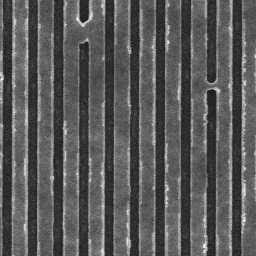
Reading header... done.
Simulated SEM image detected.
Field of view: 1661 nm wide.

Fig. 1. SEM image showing parallel lines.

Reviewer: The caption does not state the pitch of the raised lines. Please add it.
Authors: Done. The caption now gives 0.166 µm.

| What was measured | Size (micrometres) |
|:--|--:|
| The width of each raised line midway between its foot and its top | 0.103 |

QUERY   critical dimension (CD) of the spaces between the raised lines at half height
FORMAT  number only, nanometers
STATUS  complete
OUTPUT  64.9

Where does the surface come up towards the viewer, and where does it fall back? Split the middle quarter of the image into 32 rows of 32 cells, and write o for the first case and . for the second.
oooo..oooo...ooo...oooo..oooo...
oooo..oooo...ooo...oooo..oooo...
oooo..oooo...ooo...oooo..oooo...
oooo..oooo...ooo...oooo..oooo...
oooo..oooo...ooo...oooo..oooo...
oooo..oooo...ooo...oooo..oooo...
oooo..oooo...ooo...oooo..oooo...
oooo..oooo...ooo...oooo..oooo...
oooo..oooo...ooo...oooo..oooo...
oooo..oooo...ooo...oooo..oooo...
oooo..oooo...oooo..oooo..oooo...
oooo..oooo...oooo..oooo..oooo...
oooo..oooo...oooo..oooo..oooo...
oooo..oooo...ooo...oooo..oooo...
oooo..oooo...ooo...oooo..oooo...
oooo..oooo...ooo...oooo..oooo...
oooo..oooo...ooo...oooo..oooo...
oooo..oooo...ooo...oooo..oooo...
oooo..oooo...ooo...oooo..oooo...
oooo..oooo...ooo...oooo..oooo...
oooo..oooo...ooo...oooo..oooo...
oooo..oooo...ooo...oooo..oooo...
oooo..oooo...ooo...oooo..oooo...
oooo..oooo...ooo...oooo..oooo...
oooo..oooo...ooo...oooo..oooo...
oooo..oooo...ooo...oooo..oooo...
oooo..oooo...ooo...oooo...ooo...
oooo..oooo...ooo...oooo..oooo...
oooo..oooo...ooo...oooo..oooo...
oooo..oooo...ooo...oooo..oooo...
oooo..oooo...oooo..oooo..oooo...
oooo..oooo...oooo..oooo..oooo...